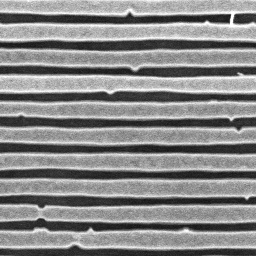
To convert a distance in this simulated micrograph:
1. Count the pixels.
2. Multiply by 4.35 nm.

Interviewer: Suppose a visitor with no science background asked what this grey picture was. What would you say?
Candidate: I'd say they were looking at parallel lines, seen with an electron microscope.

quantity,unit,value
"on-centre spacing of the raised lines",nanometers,113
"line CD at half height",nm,71.7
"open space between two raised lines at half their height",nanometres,40.2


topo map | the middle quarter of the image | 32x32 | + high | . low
++++++++++++++++++++++++++......
................................
................................
++++++++++++++++++++++++........
++++++++++++++++++++++++++++++++
++++++++++++++++++++++++++++++++
++++++++++++++++++++++++++++++++
................................
................................
................................
++++++++++++++++++++++++++++++++
++++++++++++++++++++++++++++++++
++++++++++++++++++++++++++++++++
..........++++++++++++++..+++...
................................
................................
++++++++++++++++++++++++++++++++
++++++++++++++++++++++++++++++++
++++++++++++++++++++++++++++++++
++++++++++++++++++++++++++++++++
................................
................................
........++++++++++++++++++++++++
++++++++++++++++++++++++++++++++
++++++++++++++++++++++++++++++++
++++++++++++++++++++++++++++++++
................+++++++++++++++.
................................
................................
++++++++++++++++++++++++++++++++
++++++++++++++++++++++++++++++++
++++++++++++++++++++++++++++++++